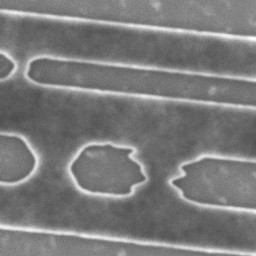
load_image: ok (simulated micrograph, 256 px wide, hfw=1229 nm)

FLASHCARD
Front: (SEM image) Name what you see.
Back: one or a few lines or trenches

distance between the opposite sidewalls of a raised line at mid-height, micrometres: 0.218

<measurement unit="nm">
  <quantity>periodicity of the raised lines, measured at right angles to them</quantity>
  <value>455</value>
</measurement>